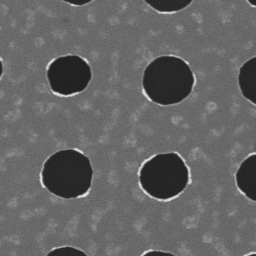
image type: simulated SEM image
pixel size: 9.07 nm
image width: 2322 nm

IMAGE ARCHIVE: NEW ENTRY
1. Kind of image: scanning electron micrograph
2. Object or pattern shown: holes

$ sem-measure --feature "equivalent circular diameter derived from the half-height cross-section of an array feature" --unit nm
439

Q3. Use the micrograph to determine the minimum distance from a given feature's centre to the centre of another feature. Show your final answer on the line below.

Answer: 873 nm